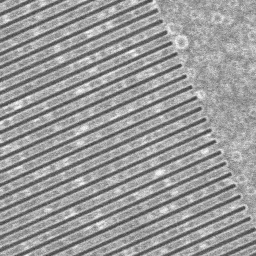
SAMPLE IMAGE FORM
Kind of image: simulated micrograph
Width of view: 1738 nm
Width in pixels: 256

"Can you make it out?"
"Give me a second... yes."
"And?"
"parallel lines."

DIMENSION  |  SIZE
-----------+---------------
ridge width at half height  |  52.6 nm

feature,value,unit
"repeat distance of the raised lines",81.3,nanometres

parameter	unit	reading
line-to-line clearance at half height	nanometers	29.4